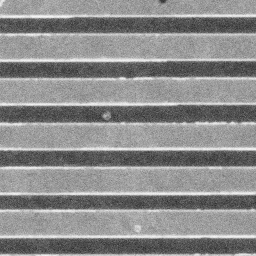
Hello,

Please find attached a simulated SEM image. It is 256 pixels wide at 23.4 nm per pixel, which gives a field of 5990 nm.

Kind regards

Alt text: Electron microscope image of lines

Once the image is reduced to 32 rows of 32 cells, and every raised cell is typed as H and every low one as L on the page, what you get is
HHHHHHHHHHHHHHHHHHHHHHHHHHHHHHHH
HHHHHHHHHHHHHHHHHHHHHHHHHHHHHHHH
LLLLLLLLLLLLLLLLLLLLLLLLLLLLLLLL
LLLLLLLLLLLLLLLLLLLLLLLLLLLLLLLL
HHHHHHHHHHHHHHHHHHHHHHHHHHHHHHHH
HHHHHHHHHHHHHHHHHHHHHHHHHHHHHHHH
HHHHHHHHHHHHHHHHHHHHHHHHHHHHHHHH
HHHHHHHHHHHHHHHHHHHLLLLLLLLLLLLL
LLLLLLLLLLLLLLLLLLLLLLLLLLLLLLLL
LLLLLLLLLLLLLLLLLLLLLLLLLLLLLLLL
HHHHHHHHHHHHHHHHHHHHHHHHHHHHHHHH
HHHHHHHHHHHHHHHHHHHHHHHHHHHHHHHH
HHHHHHHHHHHHHHHHHHHHHHHHHHHHHHHH
LLLLLLLLLLLLLLLLLLLLLLLLLLLLLLLL
LLLLLLLLLLLLLLLLLLLLLLLLLLLLLLLL
HHHHHHHHHHHHHHHHHHHHHHHHHHHHHHHH
HHHHHHHHHHHHHHHHHHHHHHHHHHHHHHHH
HHHHHHHHHHHHHHHHHHHHHHHHHHHHHHHH
HHHHHHHHHHHHHHHHHHHHHHHHHHHHHHHH
LLLLLLLLLLLLLLLLLLLLLLLLLLLLLLLL
LLLLLLLLLLLLLLLLLLLLLLLLLLLLLLLL
HHHHHHHHHHHHHHHHHHHHHHHHHHHHHHHH
HHHHHHHHHHHHHHHHHHHHHHHHHHHHHHHH
HHHHHHHHHHHHHHHHHHHHHHHHHHHHHHHH
LLLLLLLLLLLLLLLLLLLLLLLLLLLLLLLL
LLLLLLLLLLLLLLLLLLLLLLLLLLLLLLLL
HHHHHHHHHHHHHHHHHHHHHHHHHHHHHHHH
HHHHHHHHHHHHHHHHHHHHHHHHHHHHHHHH
HHHHHHHHHHHHHHHHHHHHHHHHHHHHHHHH
HHHHHHHHHHHHHHHHHHHHHHHHHHHHHHHH
LLLLLLLLLLLLLLLLLLLLLLLLLLLLLLLL
LLLLLLLLLLLLLLLLLLLLLLLLLLLLLLLL